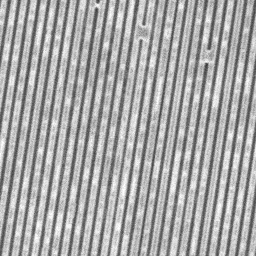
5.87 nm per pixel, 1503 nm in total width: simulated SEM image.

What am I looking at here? parallel lines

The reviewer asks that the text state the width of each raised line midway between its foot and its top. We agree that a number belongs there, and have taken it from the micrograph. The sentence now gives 27.5 nanometres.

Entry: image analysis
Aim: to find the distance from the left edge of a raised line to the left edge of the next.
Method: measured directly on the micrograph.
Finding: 57.2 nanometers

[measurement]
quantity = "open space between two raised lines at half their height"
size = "27.5 nanometers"